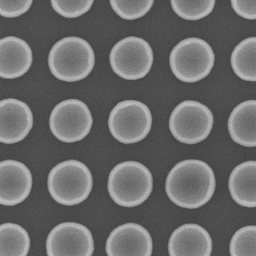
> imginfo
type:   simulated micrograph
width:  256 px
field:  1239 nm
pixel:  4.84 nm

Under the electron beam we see a regular array of raised bodies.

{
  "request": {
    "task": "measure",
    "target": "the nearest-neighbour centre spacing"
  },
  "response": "291 nm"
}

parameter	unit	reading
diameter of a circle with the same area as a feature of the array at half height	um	0.2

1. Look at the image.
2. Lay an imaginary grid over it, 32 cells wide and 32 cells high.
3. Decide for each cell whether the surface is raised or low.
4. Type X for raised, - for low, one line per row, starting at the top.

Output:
XXXX---XXXX---XXXXX---XXXXX--XXX
XXX----XXX-----XXX----XXXX----XX
--------------------------------
--------------------------------
--------------------------------
XXX----XXXX----XXX-----XXX----XX
XXXX---XXXX---XXXXX---XXXX---XXX
XXXX--XXXXXX--XXXXX--XXXXXX--XXX
XXX---XXXXX---XXXXX---XXXX---XXX
XX-----XXX-----XXX----XXX-----XX
--------------------------------
--------------------------------
--------------------------------
XXX----XXXX---XXXX----XXXX----XX
XXXX--XXXXX---XXXXX---XXXX---XXX
XXXX--XXXXX---XXXXX--XXXXX---XXX
XXX----XXXX---XXXX----XXXX---XXX
XX------X------XX------XX-----XX
--------------------------------
--------------------------------
XX------XX-----XX-----XXXX----XX
XXX----XXXX---XXXX---XXXXX---XXX
XXXX--XXXXX---XXXXX--XXXXXX--XXX
XXXX--XXXXX---XXXXX--XXXXXX--XXX
XXX----XXXX---XXXX---XXXXX---XXX
---------------XX-----XXX-----XX
--------------------------------
--------------------------------
XX-----XXXX----XXX-----XX------X
XXX---XXXXX---XXXXX---XXXX---XXX
XXXX--XXXXX---XXXXX--XXXXX---XXX
XXX---XXXXX---XXXXX--XXXXX---XXX